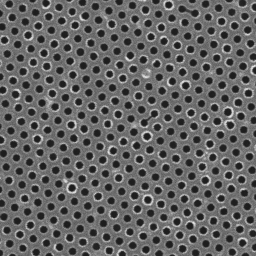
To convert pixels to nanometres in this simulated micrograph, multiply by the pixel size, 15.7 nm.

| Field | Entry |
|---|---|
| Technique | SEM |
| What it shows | a regular array of holes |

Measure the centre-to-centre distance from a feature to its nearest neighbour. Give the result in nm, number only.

214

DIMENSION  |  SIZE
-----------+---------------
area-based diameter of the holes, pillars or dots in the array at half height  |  122 nm